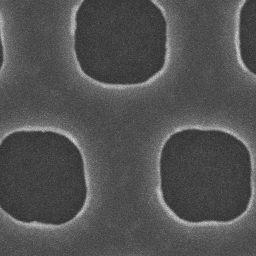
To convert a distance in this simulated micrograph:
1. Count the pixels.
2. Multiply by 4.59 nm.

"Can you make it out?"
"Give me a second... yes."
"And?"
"holes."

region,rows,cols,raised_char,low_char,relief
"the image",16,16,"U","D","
UUUUUDDDDDUUUUUD
UUUUUDDDDDUUUUUD
UUUUUDDDDDUUUUUD
UUUUUDDDDDUUUUUD
UUUUUDDDDDUUUUUU
UUUUUUUUUUUUUUUU
UUUUUUUUUUUUUUUU
UUUUUUUUUUUUUUUU
DDDDUUUUUUUDDDDU
DDDDDUUUUUDDDDDD
DDDDDUUUUUDDDDDD
DDDDDUUUUUDDDDDD
DDDDDUUUUUDDDDDD
UDDDDUUUUUUDDDDU
UUUUUUUUUUUUUUUU
UUUUUUUUUUUUUUUU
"